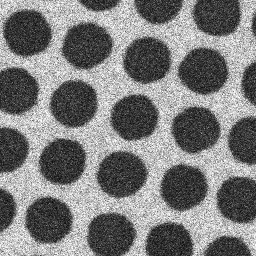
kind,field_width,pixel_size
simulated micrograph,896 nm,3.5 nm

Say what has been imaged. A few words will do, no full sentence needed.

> a regular array of holes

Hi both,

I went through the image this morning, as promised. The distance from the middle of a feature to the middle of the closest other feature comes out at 206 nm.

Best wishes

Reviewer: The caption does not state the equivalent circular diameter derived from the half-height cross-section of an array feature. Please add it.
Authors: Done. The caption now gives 167 nm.